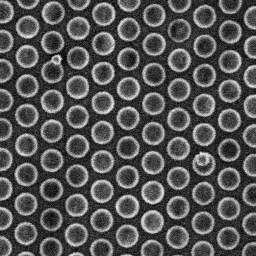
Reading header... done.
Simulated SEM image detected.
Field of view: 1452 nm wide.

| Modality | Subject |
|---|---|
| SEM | a regular array of raised bodies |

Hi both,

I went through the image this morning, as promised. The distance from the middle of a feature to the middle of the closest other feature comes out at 0.165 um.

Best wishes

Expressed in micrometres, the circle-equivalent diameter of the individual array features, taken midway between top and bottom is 0.122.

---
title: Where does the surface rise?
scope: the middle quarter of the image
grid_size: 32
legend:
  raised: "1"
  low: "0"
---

00111000111100111100011100011110
00000001111100000000111110001100
00000001111100000000111110000000
00111001111100000000111110000000
01111100111000111100111100011110
01111100000001111110000000111110
01111100000001111110000000111110
01111000011000111100011100111110
00000001111100011000111110011110
00000001111100000000111110000000
00000001111100000000111110000000
01111000111100111100111100011100
01111100000000111100000000111110
01111100000001111110000000111110
01111100010000111100000000111110
00111000111100111100111100011110
00000001111100000000111110000000
00000001111100000000111110000000
00111001111100011000111110001000
01111100111000111100011100011110
01111100000001111110000000111110
01111100000001111110000000111110
00111000111000111100011100111110
00000001111100010000111100011100
00000001111100000000111110000000
00110001111100000000111110000000
01111000111000111100111100011100
01111100000001111100000000111110
01111100000001111100000000111110
01111000111001111100001000111110
00110001111100111000111100011100
00000001111100000000111110000000